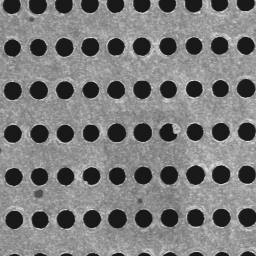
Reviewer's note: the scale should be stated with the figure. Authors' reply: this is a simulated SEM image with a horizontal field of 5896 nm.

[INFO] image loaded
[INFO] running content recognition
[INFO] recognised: a regular array of holes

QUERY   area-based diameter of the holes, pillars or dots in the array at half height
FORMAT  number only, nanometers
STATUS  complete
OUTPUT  415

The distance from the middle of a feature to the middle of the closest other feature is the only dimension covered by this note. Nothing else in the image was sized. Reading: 593 nm